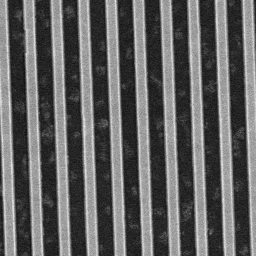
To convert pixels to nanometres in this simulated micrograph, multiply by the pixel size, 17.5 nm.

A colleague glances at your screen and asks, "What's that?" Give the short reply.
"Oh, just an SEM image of parallel lines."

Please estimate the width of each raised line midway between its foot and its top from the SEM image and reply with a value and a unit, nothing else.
191 nanometers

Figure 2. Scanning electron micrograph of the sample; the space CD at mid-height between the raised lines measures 16.4 pixels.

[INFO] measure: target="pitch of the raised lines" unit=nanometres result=479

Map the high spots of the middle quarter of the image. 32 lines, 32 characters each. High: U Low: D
DDDDUUUDDDDUUUDDDDUUDDDDDUUDDDDD
DDDDUUUDDDDUUUDDDDUUDDDDDUUDDDDD
DDDDUUUDDDDUUUDDDDUUDDDDDUUDDDDD
DDDDUUUDDDDUUUDDDDUUUDDDDUUDDDDD
DDDDUUUDDDDUUUDDDDUUUDDDDUUDDDDD
DDDDUUUDDDDUUUDDDDUUUDDDDUUDDDDD
DDDDUUUDDDDUUUDDDDUUUDDDDUUDDDDD
DDDDUUUDDDDUUUDDDDUUUDDDDUUDDDDD
DDDDUUUDDDDUUUDDDDUUUDDDDUUDDDDD
DDDDUUUDDDDUUUDDDDUUUDDDDUUUDDDD
DDDDUUUDDDDUUUDDDDUUUDDDDUUUDDDD
DDDDUUUDDDDDUUDDDDUUUDDDDUUUDDDD
DDDDDUUDDDDDUUDDDDUUUDDDDUUUDDDD
DDDDDUUDDDDDUUDDDDUUUDDDDUUUDDDD
DDDDDUUDDDDDUUDDDDUUUDDDDUUUDDDD
DDDDDUUDDDDDUUDDDDUUUDDDDUUUDDDD
DDDDDUUDDDDDUUDDDDUUUDDDDUUUDDDD
DDDDDUUDDDDDUUDDDDDUUDDDDUUUDDDD
DDDDDUUDDDDDUUDDDDDUUDDDDUUUDDDD
DDDDDUUDDDDDUUDDDDDUUDDDDUUUDDDD
UDDDDUUDDDDDUUDDDDDUUDDDDUUUDDDD
UDDDDUUDDDDDUUDDDDDUUDDDDUUUDDDD
UDDDDUUDDDDDUUDDDDDUUDDDDUUUDDDD
UDDDDUUDDDDDUUDDDDDUUDDDDDUUDDDD
UDDDDUUDDDDDUUDDDDDUUDDDDDUUDDDD
UDDDDUUDDDDDUUUDDDDUUDDDDDUUDDDD
UDDDDUUUDDDDUUUDDDDUUDDDDDUUDDDD
UDDDDUUUDDDDUUUDDDDUUDDDDDUUDDDD
UDDDDUUUDDDDUUUDDDDUUDDDDDUUDDDD
UDDDDUUUDDDDUUUDDDDUUDDDDDUUDDDD
UDDDDUUUDDDDUUUDDDDUUDDDDDUUDDDD
UDDDDUUUDDDDUUUDDDDUUUDDDDUUDDDD